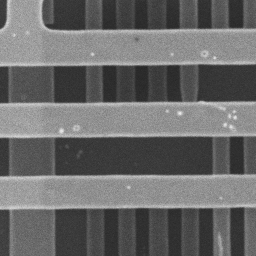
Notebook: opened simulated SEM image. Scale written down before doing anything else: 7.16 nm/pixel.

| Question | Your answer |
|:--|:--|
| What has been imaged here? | wiring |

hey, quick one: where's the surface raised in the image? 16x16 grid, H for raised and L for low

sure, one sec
HHHLLLLLLLLLLLLL
HHHLLLLLLLLLLLLL
HHHHHHHHHHHHHHHH
HHHHHHHHHHHHHHHH
LLLLLLLLLLLLLLLL
LLLLLLLLLLLLLLLL
HHHHHHHHHHHHHHHH
HHHHHHHHHHHHHHHH
HHHHHHHHHLLLLLLL
LLLLLLLLLLLLLLLL
LLLLLLLLLLLLLLLL
HHHHHHHHHHHHHHHH
HHHHHHHHHHHHHHHH
LLLLLLLLLLLLLLLL
LLLLLLLLLLLLLLLL
LLLLLLLLLLLLLLLL